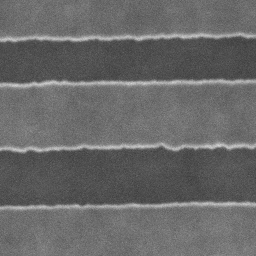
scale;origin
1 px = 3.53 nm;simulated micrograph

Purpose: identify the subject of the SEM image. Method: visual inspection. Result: lines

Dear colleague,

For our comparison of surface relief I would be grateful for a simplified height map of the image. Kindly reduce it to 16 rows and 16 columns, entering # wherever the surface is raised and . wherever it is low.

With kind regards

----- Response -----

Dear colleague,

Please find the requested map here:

################
################
#...#...........
................
................
################
################
################
################
................
................
................
................
################
################
################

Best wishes